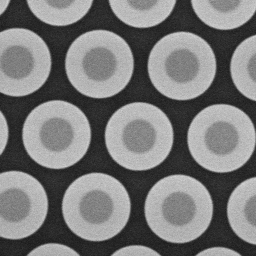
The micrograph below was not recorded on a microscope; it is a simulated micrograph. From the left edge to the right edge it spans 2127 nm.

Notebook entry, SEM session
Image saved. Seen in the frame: an array of small figures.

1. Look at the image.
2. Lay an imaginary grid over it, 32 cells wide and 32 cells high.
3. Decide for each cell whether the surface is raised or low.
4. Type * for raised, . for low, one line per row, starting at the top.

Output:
*..********...********..********
....*******...*******...********
.....*****.....*****.....******.
...........................**...
*****.....*****......****.......
******...*******....******....**
******..********...********..***
******..*********..********..***
******..*********..********..***
******..********...********..***
*****....*******...*******...***
****......*****.....*****.....**
................................
....******.....*****......****..
....*******...*******....******.
*..********..********...********
*..********..*********..********
*..********..*********.*********
*..********..********...********
....******....*******...*******.
.....****......*****.....*****..
.*..............................
*****....******.....*****......*
*****....*******...*******...***
******..********..********...***
******..********..*********.****
******..********..*********.****
******..********..********...***
*****....******....*******...***
***.......****......*****.....**
......*.........................
....*****.....*****......****...